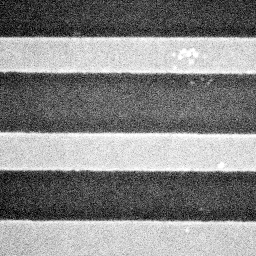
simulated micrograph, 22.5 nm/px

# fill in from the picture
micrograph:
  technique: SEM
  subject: lines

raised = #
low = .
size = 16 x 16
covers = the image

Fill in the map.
................
................
################
################
............####
................
................
................
##############..
################
################
................
................
................
################
################